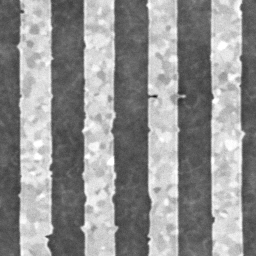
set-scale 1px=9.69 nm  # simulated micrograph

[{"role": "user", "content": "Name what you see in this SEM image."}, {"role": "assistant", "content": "one or a few lines or trenches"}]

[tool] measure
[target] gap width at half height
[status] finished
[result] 344 nanometers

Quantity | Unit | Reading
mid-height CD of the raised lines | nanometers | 276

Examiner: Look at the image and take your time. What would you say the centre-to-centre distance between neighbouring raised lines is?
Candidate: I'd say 63.7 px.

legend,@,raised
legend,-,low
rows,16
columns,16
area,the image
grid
-@@--@@--@@--@@-
-@@--@@--@@--@@-
-@@--@@--@@--@@-
-@@--@@--@@--@@-
-@@--@@--@@--@@-
-@@--@@--@@--@@-
-@@--@@--@@--@@-
-@@--@@--@@--@@-
-@@--@@--@@--@@-
-@@--@@--@@--@@-
-@@--@@--@@--@@-
-@@--@@--@@--@@-
-@@--@@--@@--@@-
-@@--@@--@@--@@-
-@@--@@--@@--@@-
-@@--@@--@@--@@-